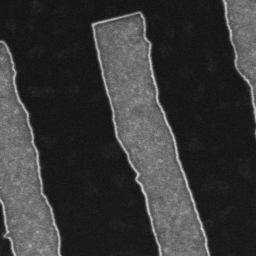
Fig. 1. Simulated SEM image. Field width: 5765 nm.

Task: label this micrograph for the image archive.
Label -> one or a few lines or trenches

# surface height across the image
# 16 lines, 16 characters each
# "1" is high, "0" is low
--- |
1111111111111100
1111110001111100
1111110001111110
0111110001111110
0111110001111110
0111111000111111
0111111000111111
0011111000111111
0011111000011111
0011111100011111
0011111100011111
0001111110001111
0001111110001111
0001111110001111
0000111111000111
1000111111000111